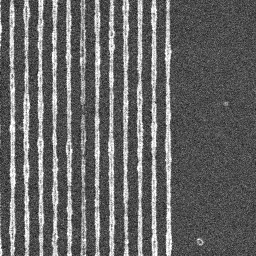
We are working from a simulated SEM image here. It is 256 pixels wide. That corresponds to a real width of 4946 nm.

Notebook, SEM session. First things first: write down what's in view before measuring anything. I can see parallel lines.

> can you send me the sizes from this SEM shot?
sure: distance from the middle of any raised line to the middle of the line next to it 274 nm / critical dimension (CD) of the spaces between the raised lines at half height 232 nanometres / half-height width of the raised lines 0.0459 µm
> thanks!